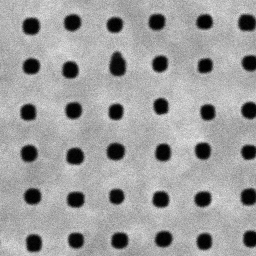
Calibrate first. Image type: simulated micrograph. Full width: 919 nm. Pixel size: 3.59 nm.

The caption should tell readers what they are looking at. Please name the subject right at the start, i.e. a regular array of holes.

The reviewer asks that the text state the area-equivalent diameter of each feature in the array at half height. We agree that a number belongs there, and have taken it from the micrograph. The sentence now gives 0.0608 um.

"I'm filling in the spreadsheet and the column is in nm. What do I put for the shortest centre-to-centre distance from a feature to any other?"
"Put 147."